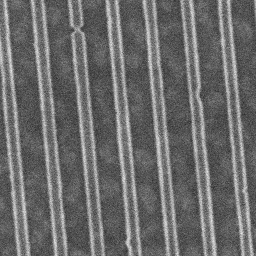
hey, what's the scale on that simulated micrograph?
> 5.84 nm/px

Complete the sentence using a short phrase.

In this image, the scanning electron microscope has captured parallel lines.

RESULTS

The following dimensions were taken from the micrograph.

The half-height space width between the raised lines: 157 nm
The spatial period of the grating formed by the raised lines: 37.1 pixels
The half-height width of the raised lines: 10.2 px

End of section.